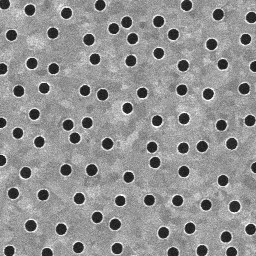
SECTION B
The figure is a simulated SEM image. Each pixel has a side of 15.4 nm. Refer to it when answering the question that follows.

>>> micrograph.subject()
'a regular array of holes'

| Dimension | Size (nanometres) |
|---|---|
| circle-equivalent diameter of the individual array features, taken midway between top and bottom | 178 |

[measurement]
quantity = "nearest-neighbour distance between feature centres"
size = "366 nm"